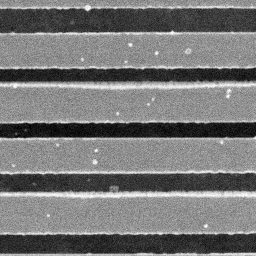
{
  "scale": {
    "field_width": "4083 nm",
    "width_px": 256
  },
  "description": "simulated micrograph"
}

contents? lines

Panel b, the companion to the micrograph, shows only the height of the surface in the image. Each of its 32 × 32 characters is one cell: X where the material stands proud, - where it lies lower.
XXXXXXXXXXXXXXXXXXXXXXXXXXXXXXXX
--------------------------------
--------------------------------
--------------------------------
XXXXXXXXXXXXXXXXXXXXXXXXXXXXXXXX
XXXXXXXXXXXXXXXXXXXXXXXXXXXXXXXX
XXXXXXXXXXXXXXXXXXXXXXXXXXXXXXXX
XXXXXXXXXXXXXXXXXXXXXXXXXXXXXXXX
XXXXXX-XXXX-XXX--X--XX-----X----
--------------------------------
XXXX-XX-----------------XXXXXXXX
XXXXXXXXXXXXXXXXXXXXXXXXXXXXXXXX
XXXXXXXXXXXXXXXXXXXXXXXXXXXXXXXX
XXXXXXXXXXXXXXXXXXXXXXXXXXXXXXXX
XXXXXXXXXXXXXXXXXXXXXXXXXXXXXXXX
--------------------------------
--------------------------------
XXXXXXXXXXXXXXXXXXXXXXXXXXXXXXXX
XXXXXXXXXXXXXXXXXXXXXXXXXXXXXXXX
XXXXXXXXXXXXXXXXXXXXXXXXXXXXXXXX
XXXXXXXXXXXXXXXXXXXXXXXXXXXXXXXX
XXXXXXXXXXXXXXXXXXXXXXXXXX--XXX-
--------------------------------
--------------------------------
XXXXXXXXXXXXXXXXXXXXXXXXXXXXXXXX
XXXXXXXXXXXXXXXXXXXXXXXXXXXXXXXX
XXXXXXXXXXXXXXXXXXXXXXXXXXXXXXXX
XXXXXXXXXXXXXXXXXXXXXXXXXXXXXXXX
XXXXXXXXXXXXXXXXXXXXXXXXXXXXXXXX
--------------------------------
--------------------------------
--------------------------------